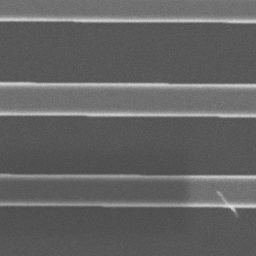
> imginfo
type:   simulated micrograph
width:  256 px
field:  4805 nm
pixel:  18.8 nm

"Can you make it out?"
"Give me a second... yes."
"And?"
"lines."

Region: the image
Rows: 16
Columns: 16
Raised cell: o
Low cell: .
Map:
oooooooooooooooo
................
................
................
................
oooooooooooooooo
oooooooooooooooo
................
................
................
................
oooooooooooooooo
oooooooooooooooo
................
................
................